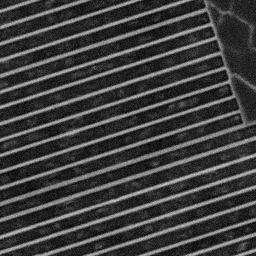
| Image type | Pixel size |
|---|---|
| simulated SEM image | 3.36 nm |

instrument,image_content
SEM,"parallel lines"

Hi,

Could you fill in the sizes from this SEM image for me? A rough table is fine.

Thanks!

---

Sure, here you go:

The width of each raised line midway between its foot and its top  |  10 nm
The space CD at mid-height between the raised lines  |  39.5 nanometers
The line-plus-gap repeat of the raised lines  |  51.3 nanometers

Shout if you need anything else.